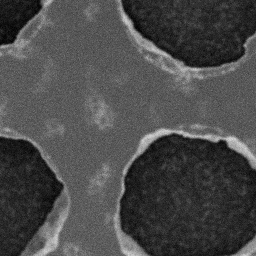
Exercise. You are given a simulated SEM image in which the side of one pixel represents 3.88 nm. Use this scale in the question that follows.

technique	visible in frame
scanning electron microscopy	holes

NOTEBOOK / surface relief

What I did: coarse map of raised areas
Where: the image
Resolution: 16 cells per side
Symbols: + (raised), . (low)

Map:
...+++++........
..++++++........
.++++++++.......
+++++++++++....+
++++++++++++++++
++++++++++++++++
++++++++++++++++
++++++++++++++++
++++++++++.+++++
..+++++++......+
...+++++........
....++++........
....++++........
....+++.........
...++++.........
...+++++........